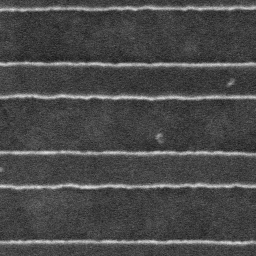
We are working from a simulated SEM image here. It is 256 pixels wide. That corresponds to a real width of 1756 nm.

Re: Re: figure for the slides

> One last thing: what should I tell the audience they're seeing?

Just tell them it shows lines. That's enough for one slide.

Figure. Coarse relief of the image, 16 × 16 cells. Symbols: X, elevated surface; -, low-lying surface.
XXXXXXXXXXXXXXXX
----------------
----------------
----------------
XXXXXXXXXXXXXXXX
XXXXXXXXXXXXXXXX
----------------
----------------
----------------
---X------------
XXXXXXXXXXXXXXXX
XXXXXXXXXXXXXXXX
----------------
----------------
----------------
XXXXXXXXXXXXXXXX